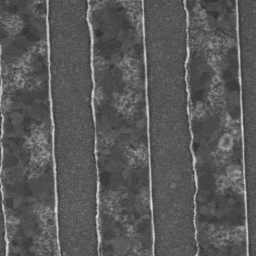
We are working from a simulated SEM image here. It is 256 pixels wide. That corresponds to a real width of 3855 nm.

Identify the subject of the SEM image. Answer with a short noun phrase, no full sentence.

one or a few lines or trenches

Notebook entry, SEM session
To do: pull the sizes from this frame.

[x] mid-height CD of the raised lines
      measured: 0.79 um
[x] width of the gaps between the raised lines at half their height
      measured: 630 nm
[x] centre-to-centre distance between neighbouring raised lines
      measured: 1.43 micrometres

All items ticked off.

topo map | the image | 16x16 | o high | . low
ooo..oooo...ooo.
ooo...ooo...ooo.
ooo...ooo...ooo.
ooo...ooo...ooo.
ooo...ooo...ooo.
ooo...ooo...ooo.
ooo...ooo...ooo.
ooo...ooo...ooo.
ooo...ooo...ooo.
ooo...ooo...ooo.
ooo...ooo...ooo.
ooo...ooo...ooo.
oooo..ooo...ooo.
oooo..oooo..ooo.
oooo..oooo..ooo.
oooo..oooo..ooo.